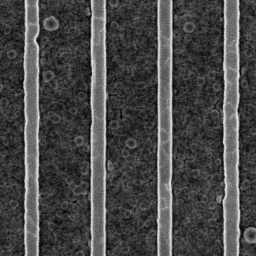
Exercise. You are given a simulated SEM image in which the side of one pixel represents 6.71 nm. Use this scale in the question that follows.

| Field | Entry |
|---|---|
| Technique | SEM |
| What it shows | one or a few lines or trenches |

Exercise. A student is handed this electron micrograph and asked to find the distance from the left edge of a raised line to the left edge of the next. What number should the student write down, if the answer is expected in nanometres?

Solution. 446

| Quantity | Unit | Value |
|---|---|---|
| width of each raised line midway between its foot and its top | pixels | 13.5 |